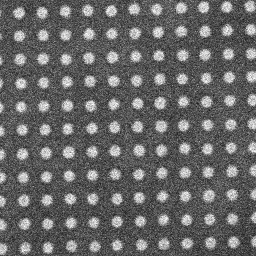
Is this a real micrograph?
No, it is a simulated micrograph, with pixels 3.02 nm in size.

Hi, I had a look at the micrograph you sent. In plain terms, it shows a regular array of raised bodies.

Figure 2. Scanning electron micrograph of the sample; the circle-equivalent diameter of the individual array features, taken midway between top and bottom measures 32.6 nm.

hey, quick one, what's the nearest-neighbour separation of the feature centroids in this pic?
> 0.0686 microns